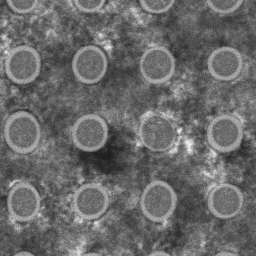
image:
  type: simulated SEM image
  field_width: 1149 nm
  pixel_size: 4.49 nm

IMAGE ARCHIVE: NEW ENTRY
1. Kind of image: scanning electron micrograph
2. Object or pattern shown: a regular array of raised bodies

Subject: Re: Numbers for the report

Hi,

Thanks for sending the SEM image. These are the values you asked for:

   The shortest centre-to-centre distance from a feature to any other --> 302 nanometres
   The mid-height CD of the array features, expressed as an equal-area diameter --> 150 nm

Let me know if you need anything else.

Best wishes